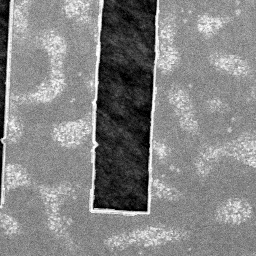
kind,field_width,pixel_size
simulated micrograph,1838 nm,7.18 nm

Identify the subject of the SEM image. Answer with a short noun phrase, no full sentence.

one or a few lines or trenches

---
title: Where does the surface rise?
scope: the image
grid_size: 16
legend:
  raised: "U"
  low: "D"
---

DUUUUUDDDDUUUUUU
DUUUUUDDDDUUUUUU
DUUUUUDDDDUUUUUU
DUUUUUDDDDUUUUUU
DUUUUUDDDDUUUUUU
UUUUUUDDDDUUUUUU
UUUUUUDDDDUUUUUU
UUUUUUDDDDUUUUUU
UUUUUUDDDUUUUUUU
UUUUUUDDDUUUUUUU
UUUUUUDDDUUUUUUU
UUUUUUDDDUUUUUUU
UUUUUUDDDUUUUUUU
UUUUUUUUUUUUUUUU
UUUUUUUUUUUUUUUU
UUUUUUUUUUUUUUUU